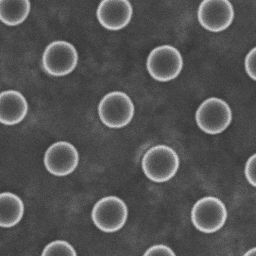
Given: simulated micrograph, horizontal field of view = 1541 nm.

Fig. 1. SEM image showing a regular array of raised bodies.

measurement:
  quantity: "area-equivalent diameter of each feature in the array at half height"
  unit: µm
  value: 0.202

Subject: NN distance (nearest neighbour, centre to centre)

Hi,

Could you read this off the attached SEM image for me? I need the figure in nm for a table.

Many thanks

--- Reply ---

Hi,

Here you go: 427